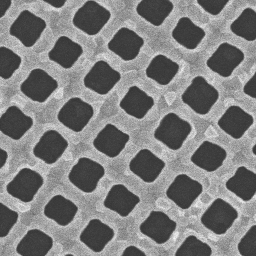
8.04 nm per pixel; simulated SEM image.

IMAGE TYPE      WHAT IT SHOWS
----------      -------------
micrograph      a regular array of holes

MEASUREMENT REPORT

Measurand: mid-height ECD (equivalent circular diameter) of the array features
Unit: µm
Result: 0.253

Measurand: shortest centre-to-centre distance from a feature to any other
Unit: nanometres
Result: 344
